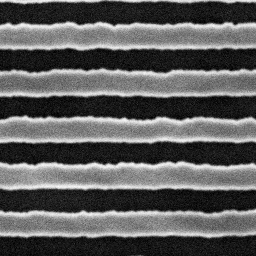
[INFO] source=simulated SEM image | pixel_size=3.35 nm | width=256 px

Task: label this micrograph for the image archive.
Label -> lines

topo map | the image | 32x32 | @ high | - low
--------------------------------
--------------------------------
--------------------------------
@@@@@@@@@@@@@@@@@@@@@@@@@@@@@@@@
@@@@@@@@@@@@@@@@@@@@@@@@@@@@@@@@
@@@@@@@@@@@@@@@@@@@@@@@@@@@@@@@@
--------------------------------
--------------------------------
--------------------------------
@@@@@@@@@@@@@@@@@@@@@@@@@@@@@@@@
@@@@@@@@@@@@@@@@@@@@@@@@@@@@@@@@
@@@@@@@@@@@@@@@@@@@@@@@@@@@@@@@@
--------------------------------
--------------------------------
--------------------------------
@@@@@@@@@@@@@@@@@@@@@@@@@@@@@@@@
@@@@@@@@@@@@@@@@@@@@@@@@@@@@@@@@
@@@@@@@@@@@@@@@@@@@@@@@@@@@@@@@@
--------------------------------
--------------------------------
@----@@----@---@@@--@@@@-------@
@@@@@@@@@@@@@@@@@@@@@@@@@@@@@@@@
@@@@@@@@@@@@@@@@@@@@@@@@@@@@@@@@
@@@@@--@@@@@@@@@@@@@@@@@@@@@@@@@
--------------------------------
--------------------------------
----@@--------@-@@@@-@@@----@@@@
@@@@@@@@@@@@@@@@@@@@@@@@@@@@@@@@
@@@@@@@@@@@@@@@@@@@@@@@@@@@@@@@@
---@--@-@@@@@--@@--------@@@----
--------------------------------
--------------------------------